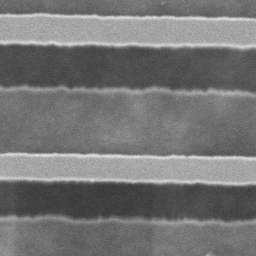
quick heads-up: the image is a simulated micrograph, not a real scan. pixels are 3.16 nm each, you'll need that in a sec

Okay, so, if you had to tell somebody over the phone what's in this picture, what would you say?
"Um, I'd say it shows lines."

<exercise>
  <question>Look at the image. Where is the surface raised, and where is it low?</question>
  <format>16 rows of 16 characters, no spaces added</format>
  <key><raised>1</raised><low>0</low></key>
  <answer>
1111111111111111
1111111111111111
1111111111111111
0000000000000000
0000000000000000
0100000000000000
1111111111111111
1111111111111111
1111111111111111
1111111111111111
1111111111111111
0000000000000011
0000000000000000
0000000000000000
1111111111111111
1111111111111111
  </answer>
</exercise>